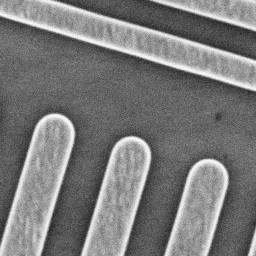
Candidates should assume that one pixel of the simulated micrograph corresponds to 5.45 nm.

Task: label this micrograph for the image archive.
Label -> groups of lines, slits or small figures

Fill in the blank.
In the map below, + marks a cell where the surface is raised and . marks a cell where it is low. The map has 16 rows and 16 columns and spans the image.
+++++......+++++
..++++++.......+
.....+++++++....
.........++++++.
............++++
...............+
................
...+............
..+++...........
..++...++.......
..++...++...++..
.+++..+++...++..
.++...+++..+++..
.++...++...+++..
+++...++...++...
+++..+++..+++...